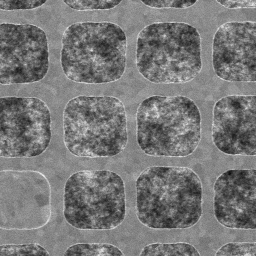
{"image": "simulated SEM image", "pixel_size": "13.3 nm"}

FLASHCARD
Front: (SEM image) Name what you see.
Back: holes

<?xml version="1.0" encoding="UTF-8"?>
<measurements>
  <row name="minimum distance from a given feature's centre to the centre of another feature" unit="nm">976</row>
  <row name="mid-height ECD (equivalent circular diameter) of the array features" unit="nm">878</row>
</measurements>